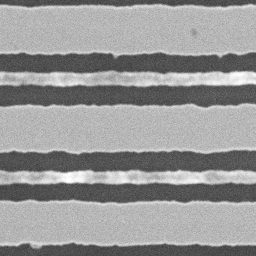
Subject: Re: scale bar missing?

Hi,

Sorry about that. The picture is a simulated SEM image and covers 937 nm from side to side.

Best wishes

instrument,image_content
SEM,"lines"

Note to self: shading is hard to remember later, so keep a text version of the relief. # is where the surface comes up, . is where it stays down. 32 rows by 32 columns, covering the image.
................................
################################
################################
################################
################################
################################
################################
................................
................................
################################
####.##########################.
................................
................................
################################
################################
################################
################################
################################
################################
................................
................................
#.##.##..###.#####..####.#######
################################
................................
................................
################################
################################
################################
################################
################################
###.####..########...###.#######
................................